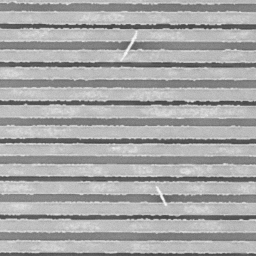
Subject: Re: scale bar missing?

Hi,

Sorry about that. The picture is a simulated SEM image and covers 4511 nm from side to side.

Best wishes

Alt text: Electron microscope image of parallel lines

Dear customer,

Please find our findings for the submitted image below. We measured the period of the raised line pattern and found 336 nm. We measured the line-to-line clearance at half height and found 136 nm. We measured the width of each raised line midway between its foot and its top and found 214 nanometers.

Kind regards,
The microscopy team